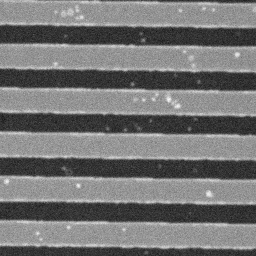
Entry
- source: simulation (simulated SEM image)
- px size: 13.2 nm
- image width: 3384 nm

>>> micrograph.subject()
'lines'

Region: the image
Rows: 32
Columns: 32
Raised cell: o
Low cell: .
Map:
oooooooooooooooooooooooooooo....
oooooooooooooooooooooooooooooooo
oooooooooooooooooooooooooooooooo
................................
................................
................................
oooooooooooooooooooooooooooooooo
oooooooooooooooooooooooooooooooo
..oooooooooooooooooooooooooooooo
................................
................................
oooooooooooooooooooooooooooooooo
oooooooooooooooooooooooooooooooo
oooooooooooooooooooooooooooooooo
................................
................................
................................
oooooooooooooooooooooooooooooooo
oooooooooooooooooooooooooooooooo
oooooooooooooooooooooooooooooooo
................................
................................
oooooooooooooooooooooooooooo....
oooooooooooooooooooooooooooooooo
oooooooooooooooooooooooooooooooo
................................
................................
................................
oooooooooooooooooooooooooooooooo
oooooooooooooooooooooooooooooooo
oooooooooooooooooooooooooooooooo
................................